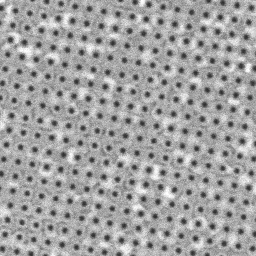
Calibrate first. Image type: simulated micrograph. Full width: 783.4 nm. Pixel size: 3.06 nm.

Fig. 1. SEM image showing a regular array of holes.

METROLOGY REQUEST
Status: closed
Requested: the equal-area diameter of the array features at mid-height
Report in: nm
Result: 16.6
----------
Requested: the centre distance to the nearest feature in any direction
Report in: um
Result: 0.0438